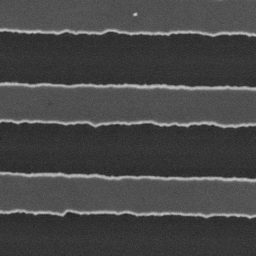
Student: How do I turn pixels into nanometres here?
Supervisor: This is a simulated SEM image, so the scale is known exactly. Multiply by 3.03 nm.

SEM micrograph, lines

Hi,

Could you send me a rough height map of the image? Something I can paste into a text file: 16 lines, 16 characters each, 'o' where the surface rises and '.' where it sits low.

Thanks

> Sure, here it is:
oooooooooooooooo
oooooooooooooooo
................
................
................
oooooooooooooooo
oooooooooooooooo
oooooooooooooooo
................
................
................
oooooooooooooooo
oooooooooooooooo
............oooo
................
................